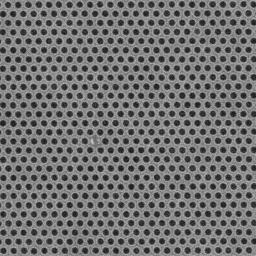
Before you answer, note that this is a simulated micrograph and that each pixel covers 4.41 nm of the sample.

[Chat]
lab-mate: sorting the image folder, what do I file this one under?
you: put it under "a regular array of holes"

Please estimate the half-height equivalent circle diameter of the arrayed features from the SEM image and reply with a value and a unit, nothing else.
31.1 nm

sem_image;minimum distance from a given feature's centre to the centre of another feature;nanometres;44.2